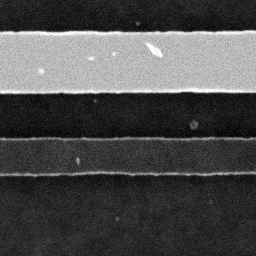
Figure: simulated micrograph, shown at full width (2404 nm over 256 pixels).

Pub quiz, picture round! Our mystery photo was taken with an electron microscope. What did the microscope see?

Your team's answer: lines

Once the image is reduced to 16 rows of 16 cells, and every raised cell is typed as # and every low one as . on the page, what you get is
................
................
################
################
################
################
................
................
................
################
################
................
................
................
................
................